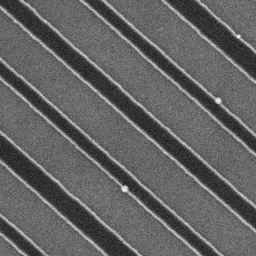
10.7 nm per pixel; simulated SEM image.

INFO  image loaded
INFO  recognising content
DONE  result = lines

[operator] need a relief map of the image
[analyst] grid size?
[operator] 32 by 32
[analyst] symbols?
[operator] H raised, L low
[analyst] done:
HHHLLLLLLLLHHHLLLLLLLHHHHLLLLLLL
LHHHHLLLLLLLHHHLLLLLLLHHHHLLLLLL
LLHHHHLLLLLLLHHHLLLLLLLHHHHHLLLL
LLLHHHHLLLLLLLHHHLLLLLLLHHHHHLLL
LLLLHHHHLLLLLLLHHHLLLLLLLHHHHHLL
LLLLLHHHHLLLLLLLHHHLLLLLLLHHHHHL
LLLLLLHHHHLLLLLLLHHHLLLLLLLLHHHH
LLLLLLLHHHHLLLLLLLHHHLLLLLLLLHHH
HLLLLLLLLHHHLLLLLLLLHHHLLLLLLLHH
HHHLLLLLLLHHHHLLLLLLLHHHLLLLLLLH
LHHHLLLLLLLHHHHLLLLLLLHHHLLLLLLL
LLHHHLLLLLLLHHHHLLLLLLLHHHLLLLLL
LLLHHHLLLLLLLHHHHLLLLLLLHHHLLLLL
LLLLHHHLLLLLLLHHHHLLLLLLLHHHLLLL
LLLLLHHHLLLLLLLHHHHLLLLLLLHHHLLL
LLLLLLHHHLLLLLLLHHHHLLLLLLLHHHLL
LLLLLLLHHHLLLLLLLLHHHLLLLLLLLHHH
HLLLLLLLLHHHLLLLLLLHHHHLLLLLLLHH
HHLLLLLLLLHHHLLLLLLLHHHHLLLLLLLH
HHHHLLLLLLLHHHLLLLLLLHHHHLLLLLLL
HHHHHLLLLLLLHHHLLLLLLLHHHHLLLLLL
LHHHHHLLLLLLLHHHLLLLLLLHHHHLLLLL
LLLHHHHLLLLLLLHHHLLLLLLLHHHHLLLL
LLLLHHHHLLLLLLLHHHLLLLLLLLHHHLLL
LLLLLHHHHLLLLLLLHHHLLLLLLLLHHHLL
LLLLLLHHHHLLLLLLLLHHHLLLLLLLHHHH
LLLLLLLHHHHHLLLLLLLHHHLLLLLLLHHH
HLLLLLLLHHHHHLLLLLLLHHHLLLLLLLHH
HHLLLLLLLHHHHHLLLLLLLHHHLLLLLLLH
HHHLLLLLLLHHHHHLLLLLLLHHHLLLLLLL
LHHHLLLLLLLLHHHHLLLLLLLHHHLLLLLL
LLLHHLLLLLLLLHHHHLLLLLLLHHHLLLLL